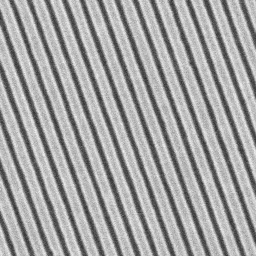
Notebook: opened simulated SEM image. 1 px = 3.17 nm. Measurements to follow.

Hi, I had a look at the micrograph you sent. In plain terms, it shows parallel lines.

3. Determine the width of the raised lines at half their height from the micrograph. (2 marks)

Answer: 29.5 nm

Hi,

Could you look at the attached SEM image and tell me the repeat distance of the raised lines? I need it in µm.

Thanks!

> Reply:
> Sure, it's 0.0527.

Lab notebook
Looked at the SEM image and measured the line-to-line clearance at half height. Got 0.0213 um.